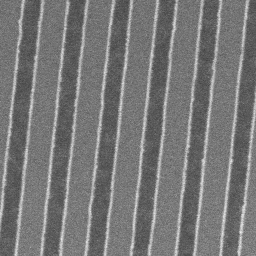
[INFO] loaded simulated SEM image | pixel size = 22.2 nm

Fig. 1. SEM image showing parallel lines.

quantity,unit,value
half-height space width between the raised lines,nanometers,566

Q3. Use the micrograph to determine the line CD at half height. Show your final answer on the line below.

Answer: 426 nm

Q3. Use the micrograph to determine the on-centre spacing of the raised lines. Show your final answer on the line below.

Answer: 0.989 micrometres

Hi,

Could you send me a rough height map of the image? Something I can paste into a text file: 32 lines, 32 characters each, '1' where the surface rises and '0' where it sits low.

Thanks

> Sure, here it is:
00011000111000110000110001110001
00011000111000110000110001100001
00011000111000110001110001100001
00011000111000110001110001100001
00011000110000110001110001100011
00111000110000110001100001100011
00111000110001110001100001100011
00110000110001110001100001100011
00110000110001110001100011100011
00110000110001100001100011100011
00110001110001100001100011000011
00110001110001100001100011000011
00110001110001100011100011000011
01110001100001100011100011000011
01110001100001100011100011000111
01110001100011100011000011000111
01110001100011100011000011000110
01100001100011100011000011000110
01100001100011100011000111000110
01100011100011000011000111000110
01100011100011000011000110000110
01100011100011000111000110000110
01100011100011000111000110000110
11100011000011000111000110001110
11100011000011000110000110001110
11100011000111000110000110001110
11000011000111000110000110001100
11000011000110000110001110001100
11000011000110000110001110001100
11000111000110000110001100001100
11000111000110000110001100001100
11000111000110001110001100001100